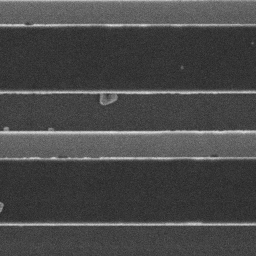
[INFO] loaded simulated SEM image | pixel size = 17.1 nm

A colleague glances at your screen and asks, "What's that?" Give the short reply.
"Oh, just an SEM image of lines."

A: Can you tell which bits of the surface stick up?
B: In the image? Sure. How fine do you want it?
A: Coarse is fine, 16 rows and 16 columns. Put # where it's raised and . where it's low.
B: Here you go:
################
################
################
################
################
################
................
................
################
################
################
################
################
################
................
................